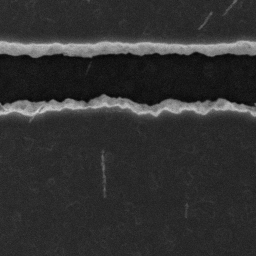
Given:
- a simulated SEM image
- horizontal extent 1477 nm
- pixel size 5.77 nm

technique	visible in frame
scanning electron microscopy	one or a few lines or trenches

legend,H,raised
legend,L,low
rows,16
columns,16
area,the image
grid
HHHHHHHHHHHHHHHH
HHHHHHHHHHHHHHHH
HHHHHHHHHHHHHHHH
LLLLLLLLLLLLLLLL
LLLLLLLLLLLLLLLL
LLLLLLLLLLLLLLLL
LLLLHLHHLLLLLLLL
HHHHHHHHHHHHHHHH
HHHHHHHHHHHHHHHH
HHHHHHHHHHHHHHHH
HHHHHHHHHHHHHHHH
HHHHHHHHHHHHHHHH
HHHHHHHHHHHHHHHH
HHHHHHHHHHHHHHHH
HHHHHHHHHHHHHHHH
HHHHHHHHHHHHHHHH